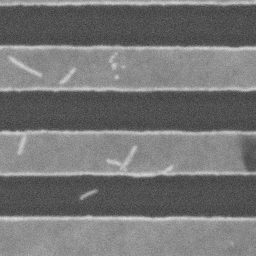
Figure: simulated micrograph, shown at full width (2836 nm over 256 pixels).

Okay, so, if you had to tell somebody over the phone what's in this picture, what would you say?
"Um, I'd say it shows lines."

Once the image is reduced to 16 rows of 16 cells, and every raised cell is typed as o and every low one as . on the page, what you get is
................
................
................
oooooooooooooooo
oooooooooooooooo
oooooooooooooooo
................
................
oooooooooooooooo
oooooooooooooooo
oooooooooooooooo
................
................
................
oooooooooooooooo
oooooooooooooooo